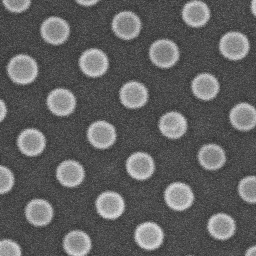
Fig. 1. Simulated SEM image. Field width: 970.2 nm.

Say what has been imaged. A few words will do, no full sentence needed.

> a regular array of raised bodies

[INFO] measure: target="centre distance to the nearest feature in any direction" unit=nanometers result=188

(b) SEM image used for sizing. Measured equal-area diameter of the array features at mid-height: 95.1 nm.